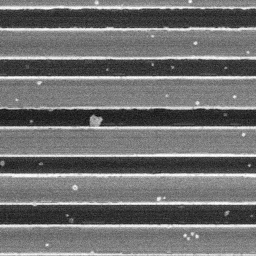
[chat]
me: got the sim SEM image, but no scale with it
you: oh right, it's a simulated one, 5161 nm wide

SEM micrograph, lines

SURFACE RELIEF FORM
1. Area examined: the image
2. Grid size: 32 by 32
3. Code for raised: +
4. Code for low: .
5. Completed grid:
++++++++++++++++++++++++++++++++
................................
................................
................................
++++++++++++++++++++++++++++++++
++++++++++++++++++++++++++++++++
++++++++++++++++++++++++++++++++
................................
................................
................................
++++++++++++++++++++++++++++++++
++++++++++++++++++++++++++++++++
++++++++++++++++++++++++++++++++
.+..............................
................................
................................
++++++++++++++++++++++++++++++++
++++++++++++++++++++++++++++++++
++++++++++++++++++++++++++++++++
................................
................................
................................
++++++++++++++++++++++++++++++++
++++++++++++++++++++++++++++++++
++++++++++++++++++++++++++++++++
++++++++++++++++++++++.+.++.....
................................
................................
++++++++++++++++++++++++++++++++
++++++++++++++++++++++++++++++++
++++++++++++++++++++++++++++++++
++++++++++++++++++++++++++++++++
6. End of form